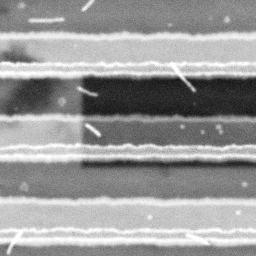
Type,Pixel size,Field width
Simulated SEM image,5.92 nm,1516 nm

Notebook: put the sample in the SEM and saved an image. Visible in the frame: lines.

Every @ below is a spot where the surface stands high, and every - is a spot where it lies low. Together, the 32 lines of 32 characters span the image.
--------------------------------
--------------------------------
--------------------------------
--------------------------------
---@@@-@@------@----@--------@--
@@@@@@@@@@@@@@@@@@@@@@@@@@@@@@@@
@@@@@@@@@@@@@@@@@@@@@@@@@@@@@@@@
@@@@@@@@@@@@@@@@@@@@@@@@@@@@@@@@
@@@@@@@@@@@@@@@@@@@@@@@@@@@@@@@@
----------------------@---------
--------------------------------
--------------------------------
--------------------------------
--------------------------------
--------------------------------
@@@@@@@@@@@@@@@@@@@@@@@@@@@@@@@@
@@@@@@@@@@@@@@@@@@@@@@@@@@@@@@@@
@@@@@@@@@@@@@@@@@@@@@@@@@@@@@@@@
@@@@@@@@@@@@@@@@@@@@@@@@@@@@@@@@
@@@@@@@@@@@@@@@@@@@@@@@@@@@@@@@@
--------------------------------
--------------------------------
--------------------------------
--------------------------------
--------------------------------
@@@@@@@@@@@@@@@@@@@@@@@@@@@@@@@@
@@@@@@@@@@@@@@@@@@@@@@@@@@@@@@@@
@@@@@@@@@@@@@@@@@@@@@@@@@@@@@@@@
@@@@@@@@@@@@@@@@@@@@@@@@@@@@@@@@
@@@@@@@@@@@@@@@@@@@@@@@@@@@@@@@@
--------------------------------
--------------------------------